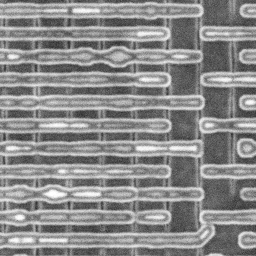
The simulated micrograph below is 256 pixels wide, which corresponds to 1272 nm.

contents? wiring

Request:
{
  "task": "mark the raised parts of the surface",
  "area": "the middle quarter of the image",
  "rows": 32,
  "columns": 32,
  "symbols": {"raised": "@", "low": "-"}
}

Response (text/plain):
------------@@@-----------------
--------------------------------
-@@@@@@@@@@@------@@@@@@@@------
@@@@@@@@@@@@@@@@@@@@@@@@@@------
@@@@@@@@@@@@@@@@@@@@@@@@@@------
--@@@@@@@-------------@@@-------
--------------------------------
--------------------------------
@@@@@@@@@@@@@@@@@@@@@@@@@@@@@@@@
@@@@@@@@@@@@@@@@@@@@@@@@@@@@@@@@
@@@@@@@@@@@@@@@@@@@@@@@@@@@@@@@@
--------------------------------
--------------------------------
--------------------------------
@@@@@@@@@@@@@@@@@@@@@@@@@@@-----
@@@@@@@@@@@@@@@@@@@@@@@@@@@-----
@@@@@@@@@@@@@@@@@@@@@@@@@@------
--------------------------------
--------------------------------
-----@@@@----@@@@-@@@@----@@@@@@
@@@@@@@@@@@@@@@@@@@@@@@@@@@@@@@@
@@@@@@@@@@@@@@@@@@@@@@@@@@@@@@@@
@@@@@@@@@@@@@@@@@@@@@@@@@@@@@@@@
--------------------------------
--------------------------------
@@@@@@@@@-@@@@@@@@@@@@-@@@------
@@@@@@@@@@@@@@@@@@@@@@@@@@------
@@@@@@@@@@@@@@@@@@@@@@@@@@------
@-------------------------------
--------------------------------
--------------------------------
@@@@@@@@@@@@@@@@@@@@@@@@@@@@@@@@